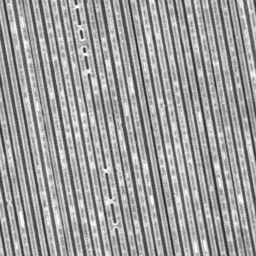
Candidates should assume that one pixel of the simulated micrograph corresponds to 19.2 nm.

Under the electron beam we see parallel lines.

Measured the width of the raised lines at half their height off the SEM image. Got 4.68 pixels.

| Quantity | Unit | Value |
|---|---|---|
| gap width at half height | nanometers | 71.1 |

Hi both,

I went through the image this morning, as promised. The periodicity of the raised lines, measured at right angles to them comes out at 169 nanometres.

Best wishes